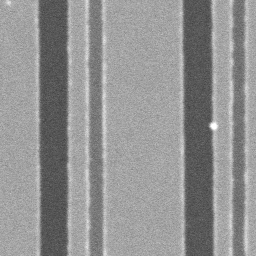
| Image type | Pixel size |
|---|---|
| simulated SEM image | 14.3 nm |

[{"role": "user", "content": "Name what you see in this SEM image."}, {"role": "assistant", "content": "lines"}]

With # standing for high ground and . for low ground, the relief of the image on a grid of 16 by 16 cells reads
##..#######..###
##..#######..###
##..#######..###
##..#######..###
##..#######..###
##..#######..###
##..#######..###
##..#######..###
##..#######..###
##..#######..###
##..#######..###
##..#######..###
##..#######..###
##..#######..###
##..#######..###
##..#######..###